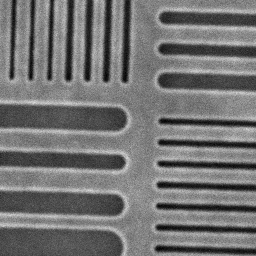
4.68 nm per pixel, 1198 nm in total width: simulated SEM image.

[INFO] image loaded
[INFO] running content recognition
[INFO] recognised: groups of lines, slits or small figures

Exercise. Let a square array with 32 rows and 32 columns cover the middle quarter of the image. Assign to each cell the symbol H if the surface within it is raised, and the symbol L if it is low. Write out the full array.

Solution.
LLHHHLLHHHLLHHLLLHHHHHHHHHHHHHHH
LLHHHLLHHHLLHHLLHHHHHHHHHHHHHHHH
LLHHHLLHHLLLHHLLHHHHHHHHLLLLLLLL
LLHHHLLHHLLLHHLLHHHHHHHLLLLLLLLL
HHHHHLHHHHLHHHLLHHHHHHHLLLLLLLLL
HHHHHHHHHHHHHHHHHHHHHHHHLLLLLLLL
HHHHHHHHHHHHHHHHHHHHHHHHHHLLLLLL
HHHHHHHHHHHHHHHHHHHHHHHHHHHHHHHH
HHHHHHHHHHHHHHHHHHHHHHHHHHHHHHHH
HHHHHHHHHHHHHHHHHHHHHHHHHHHHHHHH
LLLLLLLLLLLLLHHHHHHHHHHHHHHHHHHH
LLLLLLLLLLLLLLLHHHHHHHHHHHHHHHHH
LLLLLLLLLLLLLLLLHHHHHHHHHHHHHHHH
LLLLLLLLLLLLLLLLHHHHHHHHLLLLLLLH
LLLLLLLLLLLLLLLLHHHHHHHLLLLLLLLL
LLLLLLLLLLLLLLLLHHHHHHHHHHHLLLLL
LLLLLLLLLLLLLLLHHHHHHHHHHHHHHHHH
HHHHHHHHHHHHHHHHHHHHHHHHHHHHHHHH
HHHHHHHHHHHHHHHHHHHHHHHHHHHHHHHH
HHHHHHHHHHHHHHHHHHHHHHHLLLLLLLLL
HHHHHHHHHHHHHHHHHHHHHHHHLLLLLLLL
HHHHHHHHHHHHHHHHHHHHHHHHHHHHHHHH
LLLLLLLLLLLLLLHHHHHHHHHHHHHHHHHH
LLLLLLLLLLLLLLLHHHHHHHHHHHHHHHHH
LLLLLLLLLLLLLLLLHHHHHHHLLLLLLLLL
LLLLLLLLLLLLLLLHHHHHHHHLLLLLLLLL
HHHLLLLLLLLLLLLHHHHHHHHHHHHHHHHH
HHHHHHHHHHHHHHHHHHHHHHHHHHHHHHHH
HHHHHHHHHHHHHHHHHHHHHHHHHHHHHHHH
HHHHHHHHHHHHHHHHHHHHHHHLLLLLLLLL
HHHHHHHHHHHHHHHHHHHHHHHLLLLLLLLL
HHHHHHHHHHHHHHHHHHHHHHHHHHHHHHHL